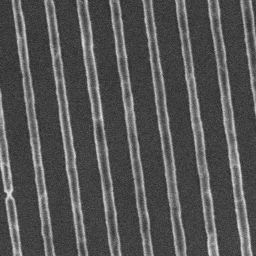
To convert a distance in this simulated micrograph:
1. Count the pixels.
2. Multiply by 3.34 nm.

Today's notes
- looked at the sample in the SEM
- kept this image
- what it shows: parallel lines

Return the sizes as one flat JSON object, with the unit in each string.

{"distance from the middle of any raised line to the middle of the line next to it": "0.108 µm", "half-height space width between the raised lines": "77 nm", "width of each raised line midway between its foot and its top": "31 nanometers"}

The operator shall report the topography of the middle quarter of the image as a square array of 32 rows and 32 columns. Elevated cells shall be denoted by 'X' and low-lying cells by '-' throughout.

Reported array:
-----XXX------XX------XX------XX
------XX------XX------XX------XX
------XX------XX------XX------XX
------XX------XX------XXX------X
------XX------XX------XXX------X
------XX------XX-------XX------X
------XXX------XX------XX------X
------XXX------XX------XX------X
X-----XXX------XX------XX------X
X------XX------XX------XX------X
X------XX------XX------XX-------
X------XX------XX------XXX------
X------XX------XX------XXX------
X------XXX------XX------XX------
X------XXX------XX------XX------
X-------XX------XX------XX------
XX------XX------XX------XX------
XX------XX------XX------XX------
XX------XX------XX------XXX-----
XX------XX------XX------XXX-----
XX------XXX-----XXX------XX-----
XX------XXX------XX------XX-----
XXX-----XXX------XX------XX-----
-XX-----XXX------XX------XX-----
-XX------XX------XX------XX-----
-XX------XX------XX------XXX----
-XX------XX------XX------XXX----
-XX------XX------XXX------XX----
-XX------XXX------XX------XX----
-XXX------XX------XX------XX----
-XX-------XX------XX------XX----
--XX------XX------XX------XX----